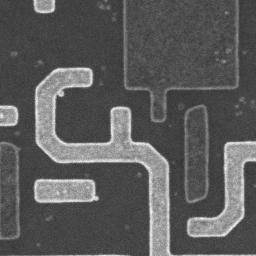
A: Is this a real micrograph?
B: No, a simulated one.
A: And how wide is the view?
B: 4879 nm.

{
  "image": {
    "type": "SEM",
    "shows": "wiring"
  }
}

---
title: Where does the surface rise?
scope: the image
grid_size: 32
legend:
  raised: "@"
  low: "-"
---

----@@@---------@@@@@@@@@@@@@@--
----------------@@@@@@@@@@@@@@--
----------------@@@@@@@@@@@@@@--
----------------@@@@@@@@@@@@@@--
----------------@@@@@@@@@@@@@@--
----------------@@@@@@@@@@@@@@--
----------------@@@@@@@@@@@@@@--
----------------@@@@@@@@@@@@@@--
----------------@@@@@@@@@@@@@@--
------@@@@@-----@@@@@@@@@@@@@@--
-----@@@@@@-----@@@@@@@@@@@@@@--
-----@@------------@@-----------
-----@@------------@@-----------
@@---@@------------@@---@@------
@@---@@-------@@---@@--@@@------
@@---@@-------@@-------@@@------
-----@@-------@@-------@@@------
-----@@-------@@-------@@@------
@@---@@@@@@@@@@@@@@----@@@--@@@@
@@----@@@@@@@@@@@@@@---@@@--@@@@
@@----------------@@@--@@@--@@@-
@@-----------------@@--@@@--@@--
@@-----------------@@--@@@--@@--
@@--@@@@@@@@-------@@--@@@--@@--
@@--@@@@@@@@-------@@--@@@--@@--
@@-----------------@@-------@@--
@@-----------------@@-------@@--
@@-----------------@@---@@@@@@--
@@-----------------@@---@@@@@---
@@-----------------@@-----------
-------------------@@-----------
-------------------@@-----------